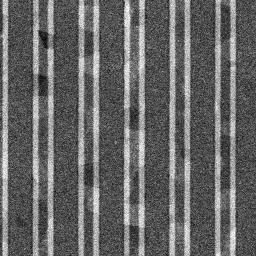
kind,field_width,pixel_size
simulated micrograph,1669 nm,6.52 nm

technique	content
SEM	parallel lines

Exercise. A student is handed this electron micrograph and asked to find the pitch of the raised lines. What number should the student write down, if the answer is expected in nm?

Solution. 297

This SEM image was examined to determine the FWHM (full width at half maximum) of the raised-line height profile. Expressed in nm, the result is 95.4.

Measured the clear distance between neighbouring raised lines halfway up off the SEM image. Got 197 nm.